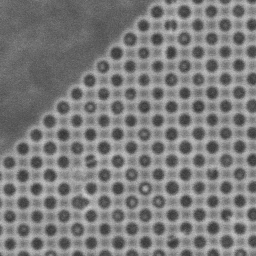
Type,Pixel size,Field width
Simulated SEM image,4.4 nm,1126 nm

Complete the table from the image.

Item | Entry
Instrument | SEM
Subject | a regular array of holes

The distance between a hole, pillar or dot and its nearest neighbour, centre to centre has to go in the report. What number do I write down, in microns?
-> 0.0833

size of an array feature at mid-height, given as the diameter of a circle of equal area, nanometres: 58.9